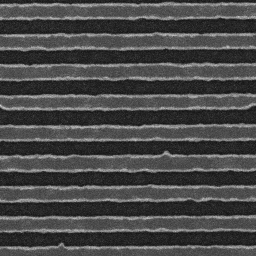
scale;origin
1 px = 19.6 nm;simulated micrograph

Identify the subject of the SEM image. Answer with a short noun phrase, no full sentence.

parallel lines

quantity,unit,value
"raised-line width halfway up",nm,275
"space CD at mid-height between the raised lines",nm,324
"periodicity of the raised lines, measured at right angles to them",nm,597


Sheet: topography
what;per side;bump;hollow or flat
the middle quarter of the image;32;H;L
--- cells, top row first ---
HHHHHLHHHHHHHHHHHHHHHHHHHHHHHHHH
HHHHHHHHHHHHHHHHHHHHHHHHHHHHHHHH
HHHHHHHHHHHHHHHHHHHHHHHHHHHHHHHH
HHHHHHHHHHHHHHHHHHHHHHHHHHHHLLHL
LLLLLLLLLLLLLLLLLLLLLLLLLLLLLLLL
LLLLLLLLLLLLLLLLLLLLLLLLLLLLLLLL
LLLLLLLLLLLLLLLLLLLLLLLLLLLLLLLL
LLLLLLLLLLLLLLLLLLLLLLLLLLLLLLLL
HHHHHHHHHHHHHHHHHHHHHHHHHHHHHHHH
HHHHHHHHHHHHHHHHHHHHHHHHHHHHHHHH
HHHHHHHHHHHHHHHHHHHHHHHHHHHHHHHH
LLLLLLLLLLLLLLLLLLLLLLLLLLLLLLLL
LLLLLLLLLLLLLLLLLLLLLLLLLLLLLLLL
LLLLLLLLLLLLLLLLLLLLLLLLLLLLLLLL
LLLLLLLLLLLLLLLLLLLLLLLLLLLLLLLL
LLLLLLLLLLLLLLLLLLLLLLLLHLLLLLLL
HHHHHHHHHHHHHHHHHHHHHHHHHHHHHHHH
HHHHHHHHHHHHHHHHHHHHHHHHHHHHHHHH
HHHHHHHHHHHHHHHHHHHHHHHHHHHHHHHH
LLLLLLLLLLLLLLLLLLLLLLLLLLLLLLLL
LLLLLLLLLLLLLLLLLLLLLLLLLLLLLLLL
LLLLLLLLLLLLLLLLLLLLLLLLLLLLLLLL
LLLLLLLLLLLLLLLLLLLLLLLLLHLLLLLL
HHHHHHHHHHHHHHHHHHHHHHHHHHHHHHHH
HHHHHHHHHHHHHHHHHHHHHHHHHHHHHHHH
HHHHHHHHHHHHHHHHHHHHHHHHHHHHHHHH
HHHHHLLLHHHHLHHHHHHHHHHHHHHHHHHH
LLLLLLLLLLLLLLLLLLLLLLLLLLLLLLLL
LLLLLLLLLLLLLLLLLLLLLLLLLLLLLLLL
LLLLLLLLLLLLLLLLLLLLLLLLLLLLLLLL
LLLLLLLLLLLLLLLLLLLLLLLLLLLLLLLL
HHHHHHHHHHHHHHHHHHHHHHHHHHHHHHHH